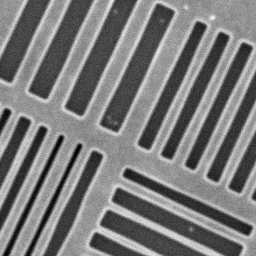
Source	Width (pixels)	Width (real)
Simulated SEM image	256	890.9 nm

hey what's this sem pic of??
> groups of lines, slits or small figures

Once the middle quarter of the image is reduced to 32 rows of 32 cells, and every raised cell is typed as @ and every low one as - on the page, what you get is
@@@@@------@@@@@------@@@@@-----
@@@@------@@@@@------@@@@@@----@
@@@@------@@@@@------@@@@@@----@
@@@------@@@@@------@@@@@@----@@
@@@------@@@@@------@@@@@-----@@
@@------@@@@@------@@@@@@----@@@
@@------@@@@@------@@@@@@----@@-
@-------@@@@------@@@@@@----@@@-
@------@@@@@------@@@@@@----@@@-
-------@@@@------@@@@@@----@@@--
------@@@@@------@@@@@@----@@@--
@-----@@@@------@@@@@@----@@@---
@@---@@@@@------@@@@@@----@@@---
@@@@@@@@@-------@@@@@----@@@----
@@@@@@@@@------@@@@@@----@@@----
@@@@@@@@@------@@@@@----@@@----@
@@@@@@@@@@@---@@@@@@----@@@----@
@@@@@@@@@@@@@@@@@@@-----@@@---@@
@@@@@@@@@@@@@@@@@@@----@@@----@@
@@@@@@@@@@@@@@@@@@-----@@----@@@
@@@--@@@@@@@@@@@@@@---@@@----@@@
@@@-@@@@@@@@@@@@@@@@--@@@---@@@@
@@--@@----@@@@@@@@@@@@@@----@@@-
@@-@@@----@@@@@@@@@@@@@@@--@@@@-
@--@@@---@@@@@@@@@@@@@@@@@@@@@--
@-@@@----@@@@@@@@@@@@@@@@@@@@@--
--@@@---@@@@@@@---@@@@@@@@@@@@@@
-@@@----@@@@@@@----@@@@@@@@@@@@@
-@@@----@@@@@@@-------@@@@@@@@@@
@@@----@@@@@@@@@@-------@@@@@@@@
@@@---@@@@@@@@@@@@@-------@@@@@@
@@----@@@@@@@--@@@@@@-------@@@@